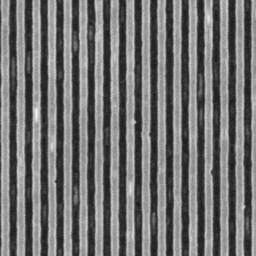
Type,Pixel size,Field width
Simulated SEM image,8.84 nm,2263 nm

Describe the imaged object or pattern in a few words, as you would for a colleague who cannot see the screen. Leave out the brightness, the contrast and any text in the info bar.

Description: parallel lines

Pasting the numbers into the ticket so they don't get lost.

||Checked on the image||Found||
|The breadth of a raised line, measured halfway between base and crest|64.1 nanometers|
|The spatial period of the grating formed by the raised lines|138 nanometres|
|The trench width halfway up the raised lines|73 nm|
